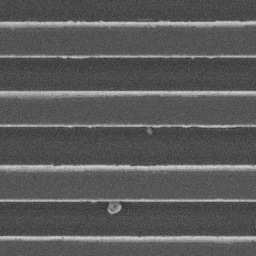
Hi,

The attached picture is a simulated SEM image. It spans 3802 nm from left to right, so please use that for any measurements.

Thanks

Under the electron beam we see lines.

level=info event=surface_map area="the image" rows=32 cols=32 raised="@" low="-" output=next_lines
--------------------------------
--------------------------------
--------------------------------
@@@@@@@@@@@@@@@@@@@@@@@@@@@@@@@@
@@@@@@@@@@@@@@@@@@@@@@@@@@@@@@@@
@@@@@@@@@@@@@@@@@@@@@@@@@@@@@@@@
@@@@@@@@@@@@@@@@@@@@@@@@@@@@@@@@
--------------------------------
--------------------------------
--------------------------------
--------------------------------
--------------------------------
@@@@@@@@@@@@@@@@@@@@@@@@@@@@@@@@
@@@@@@@@@@@@@@@@@@@@@@@@@@@@@@@@
@@@@@@@@@@@@@@@@@@@@@@@@@@@@@@@@
@@@@@@@@@@@@@@@@@@@@@@@@@@@@@@@@
--------------------------------
--------------------------------
--------------------------------
--------------------------------
--------------------------------
@@@@@@@@@@@@@@@@@@@@@@@@@@@@@@@@
@@@@@@@@@@@@@@@@@@@@@@@@@@@@@@@@
@@@@@@@@@@@@@@@@@@@@@@@@@@@@@@@@
@@@@@@@@@@@@@@@@@@@@@@@@@@@@@@@@
--------------@-----------------
--------------------------------
--------------------------------
--------------------------------
--------------------------------
@@@@@@@@@@@@@@@@@@@@@@@@@@@@@@@@
@@@@@@@@@@@@@@@@@@@@@@@@@@@@@@@@